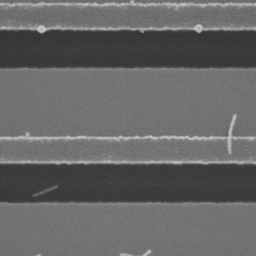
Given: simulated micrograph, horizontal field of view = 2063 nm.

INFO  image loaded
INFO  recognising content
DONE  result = lines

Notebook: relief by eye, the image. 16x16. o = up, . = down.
oooooooooooooooo
oooooooooooooooo
................
................
oooooooooooooooo
oooooooooooooooo
oooooooooooooooo
oooooooooooooooo
oooooooooooooooo
oooooooooooooooo
................
................
................
oooooooooooooooo
oooooooooooooooo
oooooooooooooooo